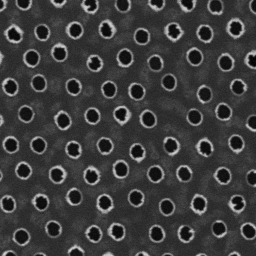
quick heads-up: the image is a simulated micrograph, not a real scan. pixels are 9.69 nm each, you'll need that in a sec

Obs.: a regular array of holes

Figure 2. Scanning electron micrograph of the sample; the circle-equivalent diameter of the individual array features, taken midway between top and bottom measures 129 nanometres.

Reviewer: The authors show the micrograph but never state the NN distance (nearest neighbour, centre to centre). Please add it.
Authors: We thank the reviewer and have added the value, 277 nm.